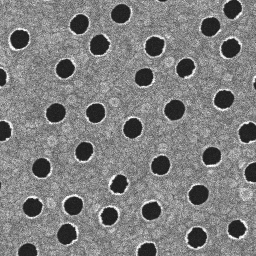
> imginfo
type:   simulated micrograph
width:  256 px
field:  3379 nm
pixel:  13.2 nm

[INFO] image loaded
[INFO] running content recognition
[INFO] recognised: a regular array of holes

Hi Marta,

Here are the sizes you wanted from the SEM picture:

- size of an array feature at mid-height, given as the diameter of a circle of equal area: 254 nanometers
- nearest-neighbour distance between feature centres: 528 nm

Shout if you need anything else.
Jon